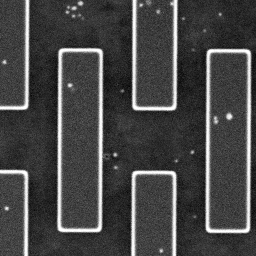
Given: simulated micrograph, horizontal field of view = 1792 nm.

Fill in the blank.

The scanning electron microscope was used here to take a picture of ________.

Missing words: groups of lines, slits or small figures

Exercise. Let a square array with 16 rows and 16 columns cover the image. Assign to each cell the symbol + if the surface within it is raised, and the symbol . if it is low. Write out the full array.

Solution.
++......+++.....
++......+++.....
++......+++.....
++..++..+++..++.
++..++..+++..+++
++..++..+++..+++
++..++..+++..+++
....++.......+++
....++.......+++
....++.......+++
....++.......+++
++..++..+++..+++
++..++..+++..+++
++..++..+++..+++
++......+++.....
++......+++.....